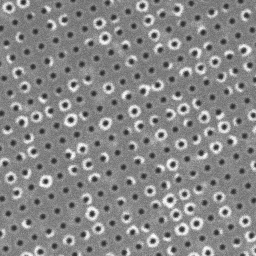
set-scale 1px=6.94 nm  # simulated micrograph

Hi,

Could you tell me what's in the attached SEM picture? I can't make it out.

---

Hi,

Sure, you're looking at a regular array of holes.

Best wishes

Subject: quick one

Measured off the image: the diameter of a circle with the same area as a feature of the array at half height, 0.0436 microns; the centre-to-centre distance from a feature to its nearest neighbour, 107 nm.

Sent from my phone